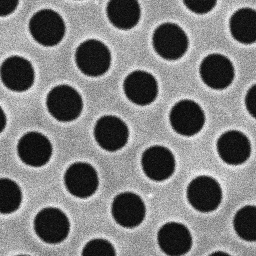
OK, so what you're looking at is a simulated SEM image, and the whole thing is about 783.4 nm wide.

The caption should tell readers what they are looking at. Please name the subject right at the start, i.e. a regular array of holes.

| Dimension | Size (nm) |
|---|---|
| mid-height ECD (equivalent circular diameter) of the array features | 109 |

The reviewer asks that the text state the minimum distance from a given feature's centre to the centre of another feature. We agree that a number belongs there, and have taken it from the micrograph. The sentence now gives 166 nm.